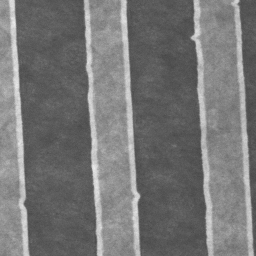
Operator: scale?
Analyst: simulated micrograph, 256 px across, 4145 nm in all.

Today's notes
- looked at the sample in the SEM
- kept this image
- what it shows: one or a few lines or trenches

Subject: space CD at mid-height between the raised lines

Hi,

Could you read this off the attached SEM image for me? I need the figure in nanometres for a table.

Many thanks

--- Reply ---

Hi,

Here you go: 1170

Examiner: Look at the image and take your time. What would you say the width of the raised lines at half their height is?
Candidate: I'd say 40.1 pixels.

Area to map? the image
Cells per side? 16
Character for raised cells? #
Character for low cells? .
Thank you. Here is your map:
#....###....###.
#....###....###.
#....###....###.
#.....##....###.
#.....##....###.
#.....##.....##.
#.....##.....##.
#.....##.....##.
#.....##.....##.
#.....##.....##.
#.....##.....##.
#.....##.....##.
#.....###....###
##....###....###
##....###....###
##....###....###